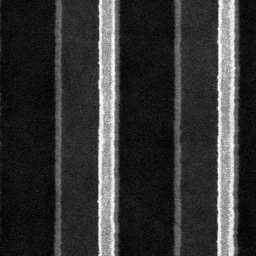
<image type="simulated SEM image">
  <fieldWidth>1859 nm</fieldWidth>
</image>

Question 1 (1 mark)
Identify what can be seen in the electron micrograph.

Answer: lines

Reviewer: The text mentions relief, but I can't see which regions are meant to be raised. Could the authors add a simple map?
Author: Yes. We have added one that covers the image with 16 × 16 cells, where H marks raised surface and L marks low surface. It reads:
LLLLHHHLLLLHHHHL
LLLLHHHLLLLHHHHL
LLLLHHHLLLLHHHHL
LLLLHHHLLLLHHHHL
LLLLHHHLLLLHHHHL
LLLLHHHLLLLHHHHL
LLLLHHHLLLLHHHHL
LLLLHHHLLLLHHHHL
LLLLHHHLLLLHHHHL
LLLLHHHLLLLHHHHL
LLLLHHHLLLLHHHHL
LLLLHHHLLLLHHHHL
LLLLHHHLLLLHHHHL
LLLLHHHLLLLHHHHL
LLLLHHHLLLLHHHHL
LLLLHHHLLLLHHHHL